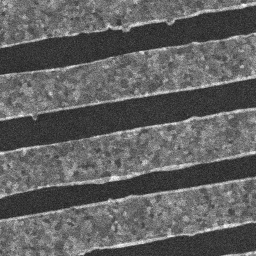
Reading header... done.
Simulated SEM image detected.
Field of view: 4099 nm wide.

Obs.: one or a few lines or trenches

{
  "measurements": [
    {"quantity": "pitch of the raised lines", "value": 1.15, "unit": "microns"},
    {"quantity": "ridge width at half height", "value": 0.684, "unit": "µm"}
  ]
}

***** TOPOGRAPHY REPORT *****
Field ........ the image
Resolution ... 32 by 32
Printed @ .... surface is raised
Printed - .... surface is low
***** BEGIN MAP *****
@@@@@@@@@@@@@@@@@@@@@@@@@@@@@@@-
@@@@@@@@@@@@@@@@@@@@@@@@@-------
@@@@@@@@@@@@@@@@@@@@@@----------
@@@@@@@@@@@@@--@----------------
@@@@@@@@-----------------------@
@@----------------------@@@@@@@@
------------------@@@@@@@@@@@@@@
-------------@@@@@@@@@@@@@@@@@@@
--------@@@@@@@@@@@@@@@@@@@@@@@@
@@@@@@@@@@@@@@@@@@@@@@@@@@@@@@@@
@@@@@@@@@@@@@@@@@@@@@@@@@@@-----
@@@@@@@@@@@@@@@@@@@@@-----------
@@@@@@@@@@@@@@@-----------------
@@@@@@@@------------------------
@@--@----------------------@@@@@
---------------------@@@@@@@@@@@
----------------@@@@@@@@@@@@@@@@
----------@@@@@@@@@@@@@@@@@@@@@@
----@@@@@@@@@@@@@@@@@@@@@@@@@@@@
@@@@@@@@@@@@@@@@@@@@@@@@@@@@@@--
@@@@@@@@@@@@@@@@@@@@@@@@--------
@@@@@@@@@@@@@@@@@@--------------
@@@@@@@@@@@@@------------------@
@@@@@--------------------@@@@@@@
------------------@@@@@@@@@@@@@@
------------@@@@@@@@@@@@@@@@@@@@
-------@@@@@@@@@@@@@@@@@@@@@@@@@
-@@@@@@@@@@@@@@@@@@@@@@@@@@@@@@@
@@@@@@@@@@@@@@@@@@@@@@@@@@@-----
@@@@@@@@@@@@@@@@@@@@@@----------
@@@@@@@@@@@@@@@@----------------
@@@@@@@@@@@---------------------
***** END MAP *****